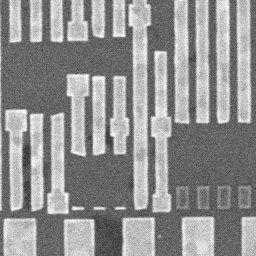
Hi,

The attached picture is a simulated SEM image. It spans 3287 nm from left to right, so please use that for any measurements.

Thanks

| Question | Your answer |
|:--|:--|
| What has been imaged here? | wiring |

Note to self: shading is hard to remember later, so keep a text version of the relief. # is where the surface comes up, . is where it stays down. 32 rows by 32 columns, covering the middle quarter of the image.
..................##...##...###.
..................##...##...###.
..................##...##...###.
.#####.###...##...##...##...###.
.#####.###...##...##...##...###.
.#####.###...##...##...##...###.
.#####.###...##...##...##...###.
.#####.###...##...##...##...###.
..###..###...##...###..##...###.
..###..###...##...###..##...###.
..###..###...##...###..##...###.
..###...##...##...###..##...###.
..###...##...##...###..##...###.
..###...##..####..###.#####.###.
..###...##..####..###.#####..##.
..###...##..####..###.#####.....
..###...##..####..###.#####.....
..###...##..####..###.#####.....
..###...##...##...###..###......
..###...##...##...###..###......
..###...##...##...###..###......
..###...##...##...###..###......
....#.............###..###......
..................###..###......
..................###..###......
..................###..###......
..................###..###......
..................###..###......
..................###..###......
..................###..###......
..................###..###......
..................###..###..###.